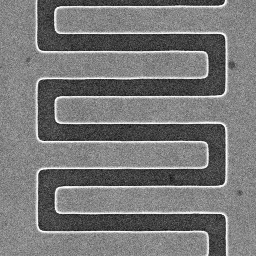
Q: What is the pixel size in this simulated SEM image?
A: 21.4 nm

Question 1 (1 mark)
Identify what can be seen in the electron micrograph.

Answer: groups of lines, slits or small figures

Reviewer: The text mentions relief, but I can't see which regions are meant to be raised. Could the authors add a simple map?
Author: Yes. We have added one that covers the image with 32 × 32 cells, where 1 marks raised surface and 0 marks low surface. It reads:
11111000000000000000000000001111
11111001111111111111111111111111
11111001111111111111111111111111
11111001111111111111111111111111
11111000000000000000000000001111
11111000000000000000000000001111
11111111111111111111111110001111
11111111111111111111111111001111
11111111111111111111111111001111
11111111111111111111111111001111
11111000000000000000000000001111
11111000000000000000000000001111
11111001111111111111111111111111
11111001111111111111111111111111
11111001111111111111111111111111
11111000000000000000000000011111
11111000000000000000000000001111
11111000000000000000000000001111
11111111111111111111111111001111
11111111111111111111111111001111
11111111111111111111111111001111
11111000000000000000000000001111
11111000000000000000000000001111
11111001111111111111111111111111
11111001111111111111111111111111
11111001111111111111111111111111
11111001111111111111111111111111
11111000000000000000000000001111
11111000000000000000000000001111
11111111111111111111111111001111
11111111111111111111111111001111
11111111111111111111111111001111